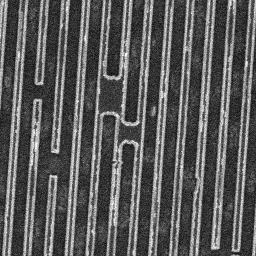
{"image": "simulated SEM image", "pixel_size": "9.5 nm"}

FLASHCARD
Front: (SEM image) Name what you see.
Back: parallel lines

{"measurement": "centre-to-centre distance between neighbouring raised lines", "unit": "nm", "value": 197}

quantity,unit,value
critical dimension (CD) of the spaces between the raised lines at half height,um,0.137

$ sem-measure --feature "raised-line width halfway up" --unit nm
63.9